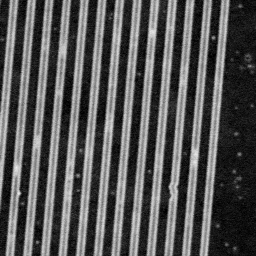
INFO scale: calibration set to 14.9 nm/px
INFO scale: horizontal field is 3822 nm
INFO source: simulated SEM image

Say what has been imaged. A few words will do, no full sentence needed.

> parallel lines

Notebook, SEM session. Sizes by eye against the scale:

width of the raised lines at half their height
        91.1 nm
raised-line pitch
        262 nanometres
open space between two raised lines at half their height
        11.5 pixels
